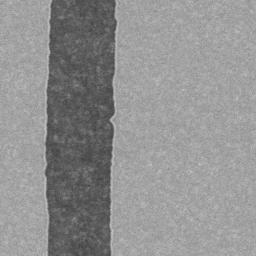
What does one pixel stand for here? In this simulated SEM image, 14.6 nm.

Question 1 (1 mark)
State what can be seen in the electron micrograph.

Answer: one or a few lines or trenches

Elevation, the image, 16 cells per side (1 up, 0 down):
1110000111111111
1110000111111111
1110000111111111
1110000111111111
1110000111111111
1110000111111111
1110000111111111
1110000111111111
1110000111111111
1110000111111111
1110000111111111
1110000111111111
1110000111111111
1110000111111111
1110000111111111
1110000111111111